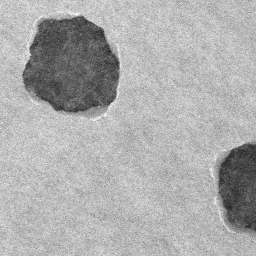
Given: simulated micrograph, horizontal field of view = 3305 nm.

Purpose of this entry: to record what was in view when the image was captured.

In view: holes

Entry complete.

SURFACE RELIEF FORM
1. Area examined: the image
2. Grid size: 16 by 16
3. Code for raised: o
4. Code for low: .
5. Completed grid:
oooooooooooooooo
oo....oooooooooo
oo.....ooooooooo
oo.....ooooooooo
o......ooooooooo
oo.....ooooooooo
ooo....ooooooooo
oooooooooooooooo
oooooooooooooooo
oooooooooooooo..
oooooooooooooo..
oooooooooooooo..
oooooooooooooo..
oooooooooooooo..
ooooooooooooooo.
oooooooooooooooo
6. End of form